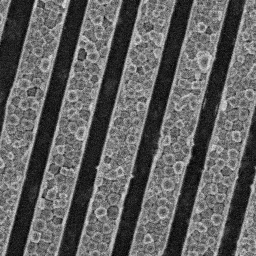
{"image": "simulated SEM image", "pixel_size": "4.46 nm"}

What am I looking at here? parallel lines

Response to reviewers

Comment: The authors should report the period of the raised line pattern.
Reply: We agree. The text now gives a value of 229 nanometers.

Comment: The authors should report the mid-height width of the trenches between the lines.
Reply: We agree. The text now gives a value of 0.0849 micrometres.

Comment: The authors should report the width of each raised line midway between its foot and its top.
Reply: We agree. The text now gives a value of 143 nm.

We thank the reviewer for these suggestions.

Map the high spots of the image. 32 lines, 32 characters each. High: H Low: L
HLLLHHHHHLLHHHHLLLHHHHLLHHHHLLLH
HLLLHHHHLLLHHHHLLHHHHLLLHHHHLLHH
HLLLHHHHLLLHHHHLLHHHHLLLHHHHLLHH
LLLLHHHHLLHHHHLLLHHHHLLHHHHHLLHH
LLLHHHHLLLHHHHLLLHHHHLLHHHHLLLHH
LLLHHHHLLLHHHHLLHHHHLLLHHHHLLLHH
LLLHHHHLLLHHHHLLHHHHLLLHHHHLLHHH
LLLHHHHLLHHHHLLLHHHHLLHHHHHLLHHH
LLHHHHHLLHHHHLLLHHHHLLHHHHLLLHHH
LLHHHHLLLHHHHLLHHHHLLLHHHHLLHHHH
LLHHHHLLHHHHLLLHHHHLLLHHHHLLHHHH
LHHHHHLLHHHHLLLHHHHLLHHHHHLLHHHH
LHHHHHLLHHHHLLLHHHHLLHHHHLLLHHHH
LHHHHLLLHHHHLLHHHHLLLHHHHLLHHHHH
LHHHHLLHHHHLLLHHHHLLLHHHHLLHHHHL
LHHHHLLHHHHLLLHHHHLLHHHHHLLHHHHL
HHHHLLLHHHHLLLHHHHLLHHHHLLLHHHHL
HHHHLLLHHHHLLHHHHLLLHHHHLLHHHHHL
HHHHLLHHHHLLLHHHHLLLHHHHLLHHHHLL
HHHHLLHHHHLLLHHHHLLHHHHHLLHHHHLL
HHHLLLHHHHLLLHHHHLLHHHHLLLHHHHLL
HHHLLLHHHHLLHHHHLLLHHHHLLHHHHHLL
HHHLLHHHHLLLHHHHLLLHHHHLLHHHHHLL
HHHLLHHHHLLLHHHHLLHHHHHLLHHHHLLL
HHLLLHHHHLLLHHHHLLHHHHLLLHHHHLLH
HHLLLHHHHLLHHHHLLLHHHHLLHHHHHLLH
HHLLHHHHLLLHHHHLLLHHHHLLHHHHLLLH
HHLLHHHHLLLHHHHLLHHHHHLLHHHHLLLH
HLLLHHHHLLLHHHHLLHHHHLLLHHHHLLHH
HLLLHHHHLLHHHHLLLHHHHLLHHHHHLLHH
HLLHHHHLLLHHHHLLLHHHHLLHHHHLLLHH
HLLHHHHLLLHHHHLLHHHHLLLHHHHLLLHH